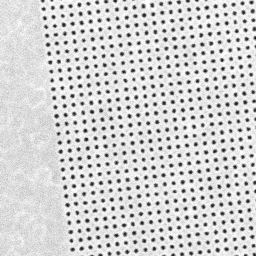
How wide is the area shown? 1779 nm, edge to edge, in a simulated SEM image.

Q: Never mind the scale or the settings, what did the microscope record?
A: a regular array of holes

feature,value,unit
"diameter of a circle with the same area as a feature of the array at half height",33.3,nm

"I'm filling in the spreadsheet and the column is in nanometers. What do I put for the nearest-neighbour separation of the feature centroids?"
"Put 60.8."